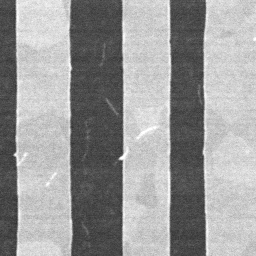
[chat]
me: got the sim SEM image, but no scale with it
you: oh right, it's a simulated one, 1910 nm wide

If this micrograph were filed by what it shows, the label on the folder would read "one or a few lines or trenches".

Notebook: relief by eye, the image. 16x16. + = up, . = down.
.+++....+++..+++
.+++....+++..+++
.+++....+++..+++
.+++....+++..+++
.+++....+++..+++
.+++....+++..+++
.+++....+++..+++
.+++....+++..+++
.+++....+++..+++
.+++....+++..+++
.+++....+++..+++
.+++....+++..+++
.+++....+++..+++
.+++....+++..+++
.+++....+++..+++
.+++....+++..+++